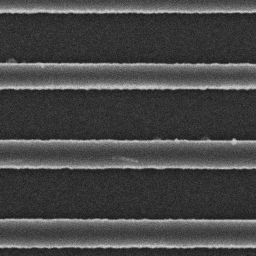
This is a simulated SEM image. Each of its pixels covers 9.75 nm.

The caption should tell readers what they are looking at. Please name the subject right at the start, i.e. lines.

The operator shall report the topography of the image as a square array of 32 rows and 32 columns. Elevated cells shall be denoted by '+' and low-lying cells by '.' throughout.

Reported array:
++++++++++++++++++++++++++++++++
++++++++++++++++++++++++++++++++
................................
................................
................................
................................
................................
................................
++++++++++++++++++++++++++++++++
++++++++++++++++++++++++++++++++
++++++++++++++++++++++++++++++++
................................
................................
................................
................................
................................
................................
................................
++++++++++++++++++++++++++++++++
++++++++++++++++++++++++++++++++
++++++++++++++++++++++++++++++++
................................
................................
................................
................................
................................
................................
++++++++++++++.++++.+++.++......
++++++++++++++++++++++++++++++++
++++++++++++++++++++++++++++++++
++++++++++++++++++++++++++++++++
................................